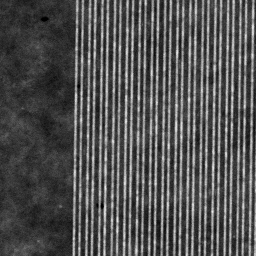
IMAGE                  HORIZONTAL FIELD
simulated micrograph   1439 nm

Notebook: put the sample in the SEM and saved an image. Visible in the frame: parallel lines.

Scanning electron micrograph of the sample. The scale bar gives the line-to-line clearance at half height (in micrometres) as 0.0253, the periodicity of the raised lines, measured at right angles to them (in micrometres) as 0.0353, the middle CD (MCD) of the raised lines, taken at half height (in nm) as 8.4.